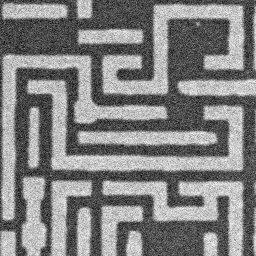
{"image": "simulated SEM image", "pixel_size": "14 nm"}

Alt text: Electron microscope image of wiring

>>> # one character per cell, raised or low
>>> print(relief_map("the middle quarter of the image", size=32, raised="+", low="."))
++++++....+++++++++....+++......
....++....+++..........+++......
....++....+++..........+++......
....++....+++..........+++......
....++....+++++++++++++++.....++
....++....+++++++++++++++....+++
....++....+++++++++++++++....+++
....++..........................
....++..........................
...++++.........................
...+++++........................
...++++++++++++++++++++++.......
...++++++++++++++++++++++.......
...+++++........................
................................
................................
................................
....++++++++++++++++++++++++++++
....++++++++++++++++++++++++++++
....++++++++++++++++++++++++++++
................................
................................
................................
++++++++++++++++++++++++++++++++
++++++++++++++++++++++++++++++++
++++++++++++++++++++++++++++++++
................................
................................
................................
++++++..........................
+++++++...+++++++++++++++....+++
+++++++...+++++++++++++++....+++